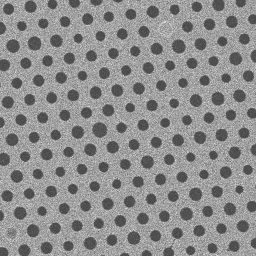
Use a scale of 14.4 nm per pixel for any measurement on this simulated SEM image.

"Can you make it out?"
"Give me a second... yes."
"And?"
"a regular array of holes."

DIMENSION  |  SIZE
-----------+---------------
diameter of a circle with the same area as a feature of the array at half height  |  161 nm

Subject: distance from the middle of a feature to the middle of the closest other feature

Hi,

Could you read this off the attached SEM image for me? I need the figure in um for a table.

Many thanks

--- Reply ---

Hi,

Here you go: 0.306